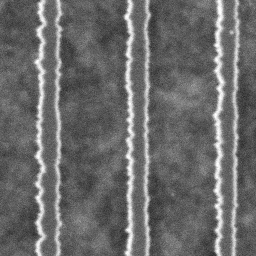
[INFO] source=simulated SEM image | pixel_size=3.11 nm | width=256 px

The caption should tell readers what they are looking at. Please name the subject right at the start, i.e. lines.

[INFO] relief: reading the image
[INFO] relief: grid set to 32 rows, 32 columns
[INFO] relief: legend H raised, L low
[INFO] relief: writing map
LLLLLHHLLLLLLLLLHHLLLLLLLLLHHHLL
LLLLLHHHLLLLLLLLHHHLLLLLLLLHHHLL
LLLLLHHLLLLLLLLLHHHLLLLLLLLHHHLL
LLLLLHHLLLLLLLLLHHLLLLLLLLLHHHLL
LLLLLHHLLLLLLLLLHHLLLLLLLLLHHHLL
LLLLLHHLLLLLLLLLHHLLLLLLLLLHHHLL
LLLLLHHLLLLLLLLLHHHLLLLLLLLHHHLL
LLLLLHHLLLLLLLLLHHLLLLLLLLLHHHLL
LLLLLHHLLLLLLLLLHHLLLLLLLLLHHHLL
LLLLLHHLLLLLLLLLHHLLLLLLLLLHHHLL
LLLLLHHLLLLLLLLLHHHLLLLLLLLHHHLL
LLLLLHHLLLLLLLLLHHLLLLLLLLLHHLLL
LLLLLHHLLLLLLLLLHHLLLLLLLLLHHLLL
LLLLLHHLLLLLLLLLHHLLLLLLLLLHHLLL
LLLLLHHLLLLLLLLLHHLLLLLLLLLHHHLL
LLLLLHHLLLLLLLLLHHLLLLLLLLLHHHLL
LLLLLHHLLLLLLLLLHHLLLLLLLLLHHLLL
LLLLLHHLLLLLLLLLHHLLLLLLLLLHHHLL
LLLLLHHLLLLLLLLLHHLLLLLLLLLHHHLL
LLLLLHHLLLLLLLLLHHLLLLLLLLLHHLLL
LLLLLHHLLLLLLLLLHHLLLLLLLLLHHHLL
LLLLLHHLLLLLLLLLHHLLLLLLLLLHHLLL
LLLLLHHLLLLLLLLLHHLLLLLLLLLHHLLL
LLLLLHHLLLLLLLLLHHLLLLLLLLLHHLLL
LLLLLHHLLLLLLLLLHHLLLLLLLLLHHHLL
LLLLLHHLLLLLLLLLHHLLLLLLLLLHHHLL
LLLLLHHLLLLLLLLLHHLLLLLLLLLHHLLL
LLLLLHHLLLLLLLLLHHLLLLLLLLLHHLLL
LLLLLHHLLLLLLLLLHHHLLLLLLLLHHLLL
LLLLLHHLLLLLLLLLHHHLLLLLLLLHHLLL
LLLLLHHLLLLLLLLLHHHLLLLLLLLHHLLL
LLLLLHHLLLLLLLLLHHLLLLLLLLLHHLLL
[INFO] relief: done